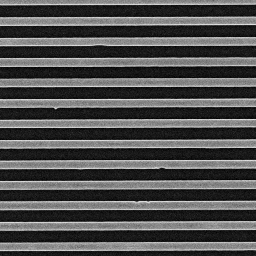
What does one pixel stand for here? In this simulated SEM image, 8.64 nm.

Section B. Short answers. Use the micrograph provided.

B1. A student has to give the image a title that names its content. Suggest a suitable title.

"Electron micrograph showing parallel lines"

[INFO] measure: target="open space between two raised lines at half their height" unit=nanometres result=104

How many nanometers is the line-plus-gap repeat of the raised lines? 177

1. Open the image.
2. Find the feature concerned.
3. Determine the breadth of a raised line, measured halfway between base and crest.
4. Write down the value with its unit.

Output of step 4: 73.4 nanometers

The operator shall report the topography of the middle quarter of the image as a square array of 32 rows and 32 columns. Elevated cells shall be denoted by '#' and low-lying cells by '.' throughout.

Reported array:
##################..............
................................
................................
................................
################################
################################
................................
................................
................................
################################
################################
................................
................................
................................
################################
################################
................................
................................
................................
################################
################################
................................
................................
................................
################################
################################
................................
................................
................................
################################
################################
................................